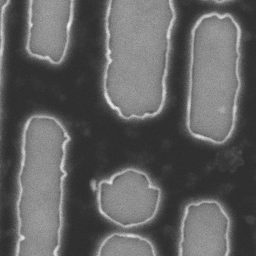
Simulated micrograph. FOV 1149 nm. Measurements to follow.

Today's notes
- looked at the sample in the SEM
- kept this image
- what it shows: one or a few lines or trenches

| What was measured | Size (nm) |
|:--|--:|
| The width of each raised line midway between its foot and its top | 154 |